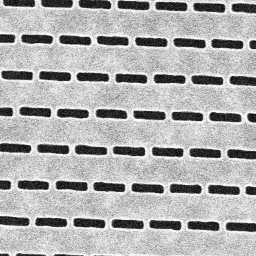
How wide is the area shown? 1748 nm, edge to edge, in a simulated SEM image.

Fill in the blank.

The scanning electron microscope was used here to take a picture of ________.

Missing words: a regular array of holes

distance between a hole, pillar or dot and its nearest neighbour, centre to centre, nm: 259